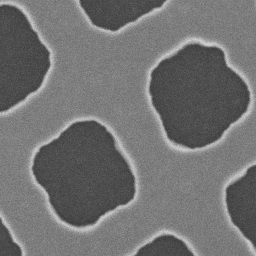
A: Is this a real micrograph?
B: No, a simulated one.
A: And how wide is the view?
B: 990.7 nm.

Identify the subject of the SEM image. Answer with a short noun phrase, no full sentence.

holes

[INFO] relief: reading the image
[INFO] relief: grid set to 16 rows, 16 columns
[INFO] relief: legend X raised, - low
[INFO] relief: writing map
-XXXX-----XXXXXX
--XXXX--XXXXXXXX
---XXXXXXXXXXXXX
---XXXXXXXX---XX
---XXXXXXX-----X
--XXXXXXX------X
-XXXXXXXXX------
XXXXXXXXXX-----X
XXXX---XXX----XX
XX------XXXXXXXX
XX------XXXXXXXX
XX------XXXXXX--
XXX-----XXXXXX--
XXXX--XXXXXXXX--
-XXXXXXXXXXXXXX-
-XXXXXXXX---XXXX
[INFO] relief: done